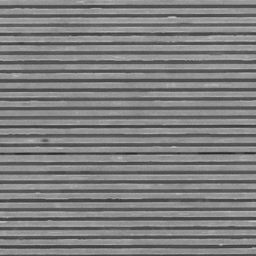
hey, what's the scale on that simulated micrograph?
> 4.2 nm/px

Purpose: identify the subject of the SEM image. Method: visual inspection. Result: parallel lines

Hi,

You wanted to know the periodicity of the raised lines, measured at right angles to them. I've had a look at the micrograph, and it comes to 38.8 nm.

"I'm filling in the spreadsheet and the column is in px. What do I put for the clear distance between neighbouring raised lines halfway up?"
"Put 3.5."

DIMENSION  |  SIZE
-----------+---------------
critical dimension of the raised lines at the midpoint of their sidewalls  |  25.2 nanometres